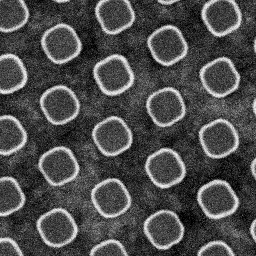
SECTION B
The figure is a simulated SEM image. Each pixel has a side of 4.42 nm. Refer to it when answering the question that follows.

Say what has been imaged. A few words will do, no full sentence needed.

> a regular array of raised bodies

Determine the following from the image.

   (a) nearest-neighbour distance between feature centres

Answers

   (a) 270 nanometers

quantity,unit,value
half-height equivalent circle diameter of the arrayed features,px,36.7